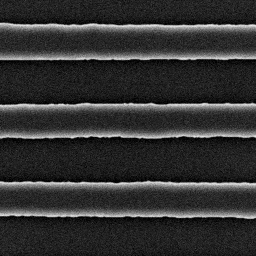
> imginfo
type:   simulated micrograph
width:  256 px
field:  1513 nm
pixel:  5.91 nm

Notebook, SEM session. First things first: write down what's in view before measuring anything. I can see lines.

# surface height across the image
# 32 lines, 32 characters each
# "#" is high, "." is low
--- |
................................
................................
................................
################################
################################
################################
################################
................................
................................
................................
................................
................................
................................
################################
################################
################################
################################
................................
................................
................................
................................
................................
................................
################################
################################
################################
################################
................................
................................
................................
................................
................................